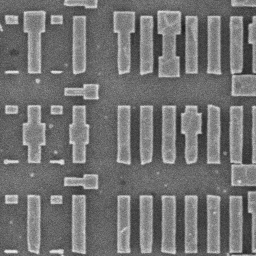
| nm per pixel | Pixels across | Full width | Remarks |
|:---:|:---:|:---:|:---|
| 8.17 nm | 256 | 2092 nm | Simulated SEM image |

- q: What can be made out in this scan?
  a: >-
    wiring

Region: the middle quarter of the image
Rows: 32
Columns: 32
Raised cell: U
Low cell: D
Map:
DDUUUDDDDDDDDDUUDDDUUUDDUUUUUDDU
DDUUUDDDDDDDDDUUDDDUUUDDUUUUUDDU
DDDDDDDDDDDDDDDDDDDUDDDDUUUUUDDD
DDDDDDDDDDDDDDDDDDDDDDDDDDDDDDDD
DDDDDDDDDDDDDDDDDDDDDDDDDDDDDDDD
DDDDDUUUDDDDDDDDDDDDDDDDDDDDDDDD
UUUUUUUUDDDDDDDDDDDDDDDDDDDDDDDD
UUUUUUUUDDDDDDDDDDDDDDDDDDDDDDDD
DDDDDUUUDDDDDDDDDDDDDDDDDDDDDDDD
DDDDDDDDDDDDDDDDDDDDDDDDDDDDDDDD
DDDDDDDDDDDDDDDDDDDDDDDDDDDDDDDD
DDUUUDDDDDDDDDUUDDDUUUDDDUUUDDUU
DDUUUDDDDDDDDDUUDDDUUUDDDUUUDUUU
DDUUUDDDDDDDDDUUDDDUUUDDDUUUDUUU
DDUUUDDDDDDDDDUUDDDUUUDDDUUUDUUU
DDUUUUDDDDDDDDUUDDDUUUDDDUUUDUUU
DDUUUUDDDDDDDDUUDDDUUUDDDUUUDUUU
DDUUUUDDDDDDDDUUDDDUUUDDDUUUDDUU
DDUUUUDDDDDDDDUUDDDUUUDDDUUUDDUU
DDUUUUDDDDDDDDUUDDDUUUDDDUUUDDDU
DDUUUDDDDDDDDDUUDDDUUUDDDUUUDDDU
DDUUUDDDDDDDDDUUDDDUUUDDDUUUDDUU
DDUUUDDDDDDDDDUUDDDUUUDDDUUUDDUU
DDUUUDDDDDDDDUUUDDDUUUDDDUUUDDUU
DDUUUDDDDDDDDDUUDDDUUDDDDUUDDDDU
DDDDDDDDDDDDDDDDDDDDDDDDDDDDDDDD
DDDDDDDDDDDDDDDDDDDDDDDDDDDDDDDD
DDDDDDDDDDDDDDDDDDDDDDDDDDDDDDDD
UUUDDUUUDDDDDDDDDDDDDDDDDDDDDDDD
UUUUUUUUDDDDDDDDDDDDDDDDDDDDDDDD
DDDDDUUUDDDDDDDDDDDDDDDDDDDDDDDD
DDDDDDDDDDDDDDDDDDDDDDDDDDDDDDDD